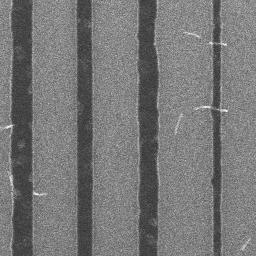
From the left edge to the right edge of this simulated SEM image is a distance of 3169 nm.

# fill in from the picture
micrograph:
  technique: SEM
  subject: one or a few lines or trenches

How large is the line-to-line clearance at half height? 44.2 px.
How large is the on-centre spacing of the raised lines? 804 nanometers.